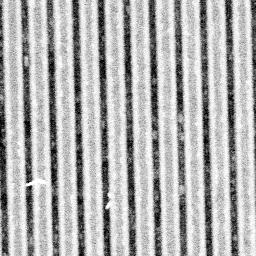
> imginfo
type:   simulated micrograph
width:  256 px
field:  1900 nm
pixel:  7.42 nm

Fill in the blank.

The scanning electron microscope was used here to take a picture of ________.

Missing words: parallel lines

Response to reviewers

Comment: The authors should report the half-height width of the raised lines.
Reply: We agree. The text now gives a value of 94.6 nm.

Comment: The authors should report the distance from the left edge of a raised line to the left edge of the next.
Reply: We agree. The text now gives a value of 189 nm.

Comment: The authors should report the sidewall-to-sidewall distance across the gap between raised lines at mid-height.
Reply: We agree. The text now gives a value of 94.6 nanometres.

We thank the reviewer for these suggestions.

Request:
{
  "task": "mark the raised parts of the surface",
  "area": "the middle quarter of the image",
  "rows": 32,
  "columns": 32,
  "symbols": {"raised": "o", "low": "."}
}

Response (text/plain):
oo...ooo...ooo....ooo...ooo....o
oo...ooo...ooo....ooo...ooo....o
oo...ooo...ooo....ooo...ooo....o
oo...ooo...ooo....ooo...ooo....o
oo...ooo...ooo....ooo...ooo....o
oo...ooo...oooo...ooo...ooo....o
oo...ooo...oooo...ooo...ooo....o
oo...ooo...oooo...ooo...ooo....o
oo...ooo...oooo...ooo...ooo....o
oo...ooo...oooo...ooo...ooo....o
oo...ooo...oooo...ooo...ooo....o
oo...ooo...ooo....ooo...ooo....o
oo...ooo....oo....ooo...ooo....o
oo...ooo....ooo...ooo...ooo....o
oo...ooo....ooo...ooo...oooo...o
oo...ooo....ooo...ooo...oooo...o
oo...ooo....ooo...ooo...oooo...o
oo...ooo....ooo...ooo....ooo...o
oo....oo....ooo...ooo....ooo...o
oo....oo....ooo...ooo....ooo...o
oo....ooo...ooo...ooo....ooo...o
oo....ooo...ooo...ooo....ooo...o
oo....ooo...ooo...ooo....ooo...o
oo....ooo...ooo...ooo....ooo...o
oo....ooo...ooo...ooo....ooo...o
oo....ooo...ooo...ooo....ooo...o
oo....ooo...ooo...ooo....ooo...o
oo....ooo...ooo...ooo....ooo...o
oo....ooo...ooo....oo....ooo...o
oo....ooo...ooo....oo....ooo...o
oo....ooo...ooo....oo....ooo...o
oo....ooo...ooo....oo....ooo...o